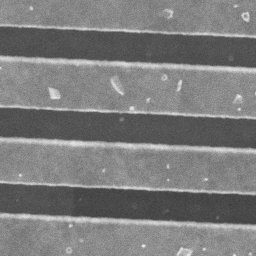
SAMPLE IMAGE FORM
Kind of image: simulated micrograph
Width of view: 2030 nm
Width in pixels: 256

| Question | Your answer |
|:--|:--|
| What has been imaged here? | lines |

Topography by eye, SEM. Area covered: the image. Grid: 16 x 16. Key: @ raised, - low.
@@@@@@@@@@@@@@@@
@@@@@@@@@@@@@@@@
----------------
----------------
@@@@@@@@@@@@@@@@
@@@@@@@@@@@@@@@@
@@@@@@@@@@@@@@@@
----------------
----------------
@@@@@@@@@@@@@@@@
@@@@@@@@@@@@@@@@
-@@@@@@@@@@@@@@@
----------------
@@@-------------
@@@@@@@@@@@@@@@@
@@@@@@@@@@@@@@@@